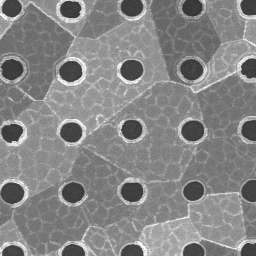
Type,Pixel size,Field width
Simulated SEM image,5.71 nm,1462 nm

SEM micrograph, a regular array of holes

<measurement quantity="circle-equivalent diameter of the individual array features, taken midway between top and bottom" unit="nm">125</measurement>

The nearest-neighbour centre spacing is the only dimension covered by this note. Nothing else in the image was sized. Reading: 340 nanometres